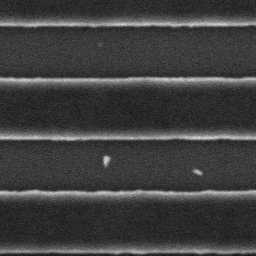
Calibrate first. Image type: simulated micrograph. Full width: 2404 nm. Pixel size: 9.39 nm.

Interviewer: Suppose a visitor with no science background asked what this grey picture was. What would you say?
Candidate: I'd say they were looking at lines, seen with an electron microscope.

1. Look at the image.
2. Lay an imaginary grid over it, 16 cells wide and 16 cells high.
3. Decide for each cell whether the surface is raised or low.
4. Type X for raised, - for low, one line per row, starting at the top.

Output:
XXXXXXXXXXXXXXXX
XXXXXXXXXXXXXXXX
----------------
----------------
----------------
XXXXXXXXXXXXXXXX
XXXXXXXXXXXXXXXX
XXXXXXXXXXXXXXXX
XXXXXXXXXXXXXXXX
----------------
----------------
----------------
XXXXXXXXXXXXXXXX
XXXXXXXXXXXXXXXX
XXXXXXXXXXXXXXXX
XXXXXXXXXXXXXXXX